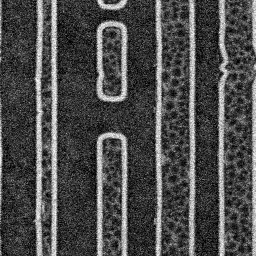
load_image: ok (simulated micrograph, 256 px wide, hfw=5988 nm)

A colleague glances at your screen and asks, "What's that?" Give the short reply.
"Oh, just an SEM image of one or a few lines or trenches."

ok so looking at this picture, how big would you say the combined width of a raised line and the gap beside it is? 1500 nanometers